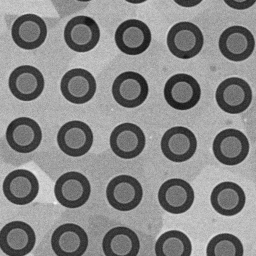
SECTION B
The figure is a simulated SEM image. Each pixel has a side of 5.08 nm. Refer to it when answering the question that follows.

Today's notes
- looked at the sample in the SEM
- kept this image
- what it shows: an array of small figures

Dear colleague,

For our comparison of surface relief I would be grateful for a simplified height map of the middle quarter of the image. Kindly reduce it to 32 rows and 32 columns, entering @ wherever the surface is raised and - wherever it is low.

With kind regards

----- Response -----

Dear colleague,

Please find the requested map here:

@@@@@@@@@@@@@@@@@@@@@@@@@@@@@@@@
@-----@@@@@@@@@@@@@@@@@@@@@@@@@@
-------@@@@@@@-----@@@@@@@@@---@
--@@@---@@@@@-------@@@@@@------
-@@@@@--@@@@---@@@---@@@@-------
-@@@@@--@@@@--@@@@@--@@@@---@@@@
-@@@@@--@@@@--@@@@@--@@@@--@@@@@
--@@@---@@@@--@@@@@--@@@@--@@@@@
-------@@@@@---@@@---@@@@--@@@@@
@-----@@@@@@@-------@@@@@@---@--
@@@@@@@@@@@@@@-----@@@@@@@@-----
@@@@@@@@@@@@@@@@@@@@@@@@@@@@---@
@@@@@@@@@@@@@@@@@@@@@@@@@@@@@@@@
@@@@@@@@@@@@@@@@@@@@@@@@@@@@@@@@
@----@@@@@@@@-@@@@@@@@@@@@@@@@@@
------@@@@@@@------@@@@@@@@@--@@
-@@@---@@@@@-------@@@@@@@------
-@@@@--@@@@@--@@@@--@@@@@-------
@@@@@--@@@@--@@@@@--@@@@---@@@@-
@@@@@--@@@@--@@@@@--@@@@--@@@@@-
-@@@---@@@@@--@@@@--@@@@--@@@@@-
------@@@@@@--@@@---@@@@---@@@@-
-----@@@@@@@@------@@@@@@-------
@@@@@@@@@@@@@@---@@@@@@@@@------
@@@@@@@@@@@@@@@@@@@@@@@@@@@@-@@@
@@@@@@@@@@@@@@@@@@@@@@@@@@@@@@@@
@@@@@@@@@@@@@@@@@@@@@@@@@@@@@@@@
-----@@@@--@@@@@@@@@@@@@@@@@@@@@
------@@-@@@------@@@@@@@@@-@@@@
@@@@--@@@@@--------@@@@@@------@
@@@@---@@@@--@@@@--@@@@@--------
@@@@@--@@@---@@@@@--@@@@--@@@@--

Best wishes